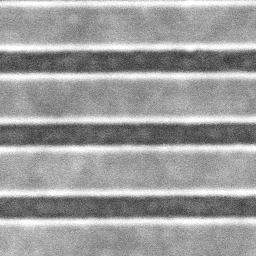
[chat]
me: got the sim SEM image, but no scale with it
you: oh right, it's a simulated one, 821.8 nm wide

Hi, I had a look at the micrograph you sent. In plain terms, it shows one or a few lines or trenches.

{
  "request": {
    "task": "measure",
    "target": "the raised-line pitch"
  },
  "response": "233 nanometres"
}